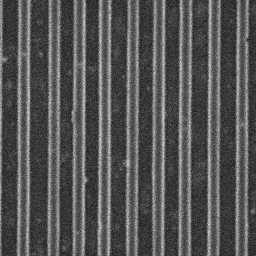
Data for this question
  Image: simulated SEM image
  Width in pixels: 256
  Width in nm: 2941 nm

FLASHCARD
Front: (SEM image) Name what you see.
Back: parallel lines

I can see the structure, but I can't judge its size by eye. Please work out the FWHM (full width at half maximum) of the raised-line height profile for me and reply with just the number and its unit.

115 nanometers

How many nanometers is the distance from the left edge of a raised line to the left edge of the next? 314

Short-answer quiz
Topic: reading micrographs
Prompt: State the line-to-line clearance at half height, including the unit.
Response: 195 nm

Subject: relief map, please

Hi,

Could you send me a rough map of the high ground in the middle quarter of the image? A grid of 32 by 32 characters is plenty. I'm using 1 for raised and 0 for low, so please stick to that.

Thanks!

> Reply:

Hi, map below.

00011000011000001100000110000111
00011000011000001110000110000111
00011000011000001100001110000110
00011000011000001100001110000110
00011000011000001100001110000110
00011000011000001100001110000110
00011000011000001100001110000110
00011000011000001100001110000110
00011000011000001100001110000110
00011000011000001100001110000110
00011000011000001100001110000110
00111000011000001100001110000110
00111000011000001100001110000110
00111000011000001100001110000110
00111000011000001100001110000110
00011000011000001100001110000110
00011000011000001100001110000110
00011000011000001100001110000110
00011000011000001100001110000110
00111000011000001100001110000110
00111000011000001100001110000110
00111000011000001100001110000110
00111000011000001100001110000110
00011000011000001100001110000110
00011000011000001100001110000110
00011000011000001100001110000110
00011000011000001100001110000110
00011000011000001100001110000110
00011000011000001100001110000110
00011000011000001100001110000110
00011000011000001100001110000110
00011000011000001100001110000110